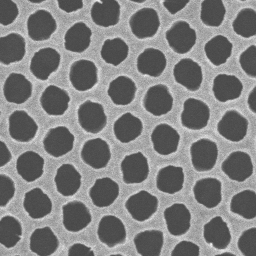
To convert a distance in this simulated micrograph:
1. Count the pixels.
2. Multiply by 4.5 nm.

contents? a regular array of holes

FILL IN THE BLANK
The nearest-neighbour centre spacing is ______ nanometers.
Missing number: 170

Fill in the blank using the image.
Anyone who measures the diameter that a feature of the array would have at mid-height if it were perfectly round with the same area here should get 131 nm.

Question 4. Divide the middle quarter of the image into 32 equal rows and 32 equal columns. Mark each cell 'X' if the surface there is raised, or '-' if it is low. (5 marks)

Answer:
XX------XXXXXXXXXX-------XXX----
XX------XXXXXXXXXXX------XX-----
X-------XXXXXXXXXXXX----XXX-----
X-------XXXXX---XXXXXXXXXXXX----
XX------XXXX-----XXXXXXXXXXX----
XX-----XXXX-------XXXX---XXXXX--
XXX---XXXXX-------XXX-----XXXXXX
-XXXXXXXXXX-------XXX-----XXXXXX
-XXXXXXXXXXX-----XXXX------XXXXX
-XXXX--XXXXX-----XXX-------XXX--
-XXX-----XXXXXXXXXXX-------XXX--
-XXX------XXXXXXXXXXX------XXX--
XXXX------XXXXX--XXXXX---XXXX---
XXXX-------XXX-----XXXXXXXXXX---
XXXX-------XX------XXXXXXXXXX---
XXXX------XX--------XXX---XXXX--
-XXXX----XXX-------XXXX-----XXXX
--XXXXXXXXXXX------XXX-------XXX
---XXXXX-XXXX-----XXXX-------XXX
--XXXX----XXXX--XXXXXX-------XXX
--XXX------XXXXXXXXXXX------XXXX
--XXX------XXXXXXXXXXXX-----XXXX
XXXX--------XXXXX---XXXX--XXXXXX
XXXXX-------XXX-----XXXXXXXXXXXX
XXXXX------XXX-------XXXXXXXXXXX
--XXXXX---XXXX-------XXXXX--XXXX
---XXXXXXXXXXXX------XXX------XX
----XXXXXXXXXXX------XXX------XX
----XXXXXX-XXXX------XX-------XX
----XXXX-----XX----XXXX-------XX
----XXX-------XXXXXXXXX-------XX
---XXXX-------XXXXXXXXXX-----XXX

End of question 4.